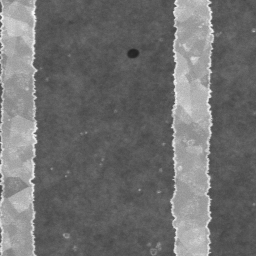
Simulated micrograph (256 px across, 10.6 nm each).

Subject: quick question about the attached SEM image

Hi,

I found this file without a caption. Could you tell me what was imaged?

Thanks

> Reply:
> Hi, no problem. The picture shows one or a few lines or trenches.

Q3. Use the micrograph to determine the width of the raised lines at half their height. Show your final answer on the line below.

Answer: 355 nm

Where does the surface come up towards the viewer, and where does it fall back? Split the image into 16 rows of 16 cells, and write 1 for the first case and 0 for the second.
1100000000011000
1100000000011000
1100000000011000
1100000000011000
1100000000011000
1100000000011000
1100000000011000
1100000000011000
1100000000011000
1100000000011000
1100000000011000
1100000000011000
1100000000011000
1100000000011000
1100000000011000
1100000000011000